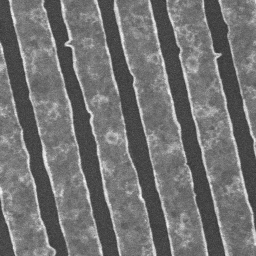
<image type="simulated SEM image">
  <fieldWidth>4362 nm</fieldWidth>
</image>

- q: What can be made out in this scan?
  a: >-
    parallel lines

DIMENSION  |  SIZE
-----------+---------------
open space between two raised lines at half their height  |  0.293 micrometres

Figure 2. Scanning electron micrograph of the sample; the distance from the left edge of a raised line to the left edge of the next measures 874 nm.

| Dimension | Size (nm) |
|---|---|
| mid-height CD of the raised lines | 583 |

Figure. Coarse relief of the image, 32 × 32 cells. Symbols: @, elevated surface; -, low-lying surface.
-@@@@---@@@@--@@@@@--@@@@---@@@@
-@@@@@--@@@@---@@@@--@@@@@--@@@@
--@@@@--@@@@@--@@@@--@@@@@--@@@@
--@@@@--@@@@@--@@@@---@@@@---@@@
--@@@@@--@@@@--@@@@@--@@@@--@@@@
--@@@@@--@@@@--@@@@@--@@@@@--@@@
---@@@@--@@@@---@@@@---@@@@--@@@
@--@@@@--@@@@@--@@@@---@@@@--@@@
@--@@@@--@@@@@--@@@@---@@@@--@@@
@--@@@@@--@@@@---@@@@--@@@@---@@
@--@@@@@--@@@@---@@@@--@@@@@--@@
@---@@@@--@@@@@--@@@@---@@@@--@@
@@--@@@@@--@@@@--@@@@@--@@@@--@@
@@--@@@@@--@@@@--@@@@@--@@@@---@
@@--@@@@@--@@@@---@@@@--@@@@@--@
@@---@@@@--@@@@@--@@@@--@@@@@--@
@@@--@@@@---@@@@--@@@@---@@@@--@
@@@--@@@@---@@@@--@@@@@--@@@@---
@@@--@@@@@--@@@@---@@@@--@@@@@--
@@@@--@@@@--@@@@---@@@@--@@@@@--
@@@@--@@@@---@@@@--@@@@---@@@@--
@@@@--@@@@---@@@@--@@@@@--@@@@--
@@@@--@@@@@--@@@@---@@@@--@@@@--
@@@@---@@@@--@@@@@--@@@@--@@@@@-
@@@@@--@@@@--@@@@@--@@@@---@@@@-
@@@@@--@@@@---@@@@--@@@@@--@@@@-
@@@@@--@@@@@--@@@@---@@@@--@@@@@
-@@@@--@@@@@--@@@@@--@@@@--@@@@@
-@@@@@--@@@@--@@@@@--@@@@--@@@@@
-@@@@@--@@@@---@@@@--@@@@---@@@@
--@@@@--@@@@---@@@@--@@@@@--@@@@
--@@@@@--@@@@--@@@@--@@@@@--@@@@